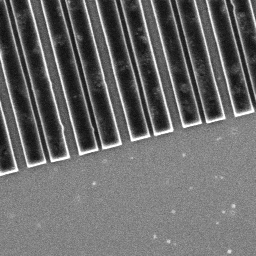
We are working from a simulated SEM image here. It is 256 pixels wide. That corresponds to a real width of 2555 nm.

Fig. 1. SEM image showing parallel lines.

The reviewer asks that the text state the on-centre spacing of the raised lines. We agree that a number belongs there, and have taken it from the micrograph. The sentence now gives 263 nm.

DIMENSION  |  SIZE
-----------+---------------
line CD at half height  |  188 nm